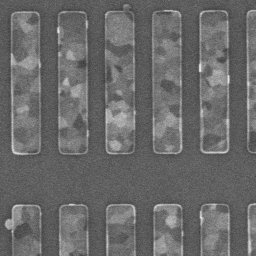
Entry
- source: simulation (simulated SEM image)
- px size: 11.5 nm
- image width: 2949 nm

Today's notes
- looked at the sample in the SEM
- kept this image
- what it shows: groups of lines, slits or small figures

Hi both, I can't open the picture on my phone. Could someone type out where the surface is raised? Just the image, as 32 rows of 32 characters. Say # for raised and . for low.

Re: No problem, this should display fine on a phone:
................................
..............##....##....##...#
.####..####..####..####..###...#
.####..####..####..####..###...#
.####..####..####..####..###...#
.####..####..####..####..###...#
.####..####..####..####..###...#
.####..####..####..####..###...#
.####..####..####..####..###...#
.####..####..####..####..###...#
.####..####..####..####..###...#
.####..####..####..####..###...#
..###..####..####..####..###...#
..###..####..####..####..###...#
..###..####..####..####..###...#
..###..####..####..####..###...#
..###..####..####..####..###...#
..###..####..####..####..###...#
..###..####..####..####..###...#
................................
................................
................................
................................
................................
................................
................................
..###...###..####..####..####..#
.####...###..####..####..####..#
.####...###..####..####..####..#
..###...###..####..####..####..#
..###...###..####..####..####..#
..###...###..####..####..####..#